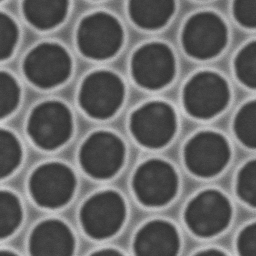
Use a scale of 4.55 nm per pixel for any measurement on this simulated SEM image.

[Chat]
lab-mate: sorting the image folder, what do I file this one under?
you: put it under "a regular array of holes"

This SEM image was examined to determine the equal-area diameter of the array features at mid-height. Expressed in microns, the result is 0.218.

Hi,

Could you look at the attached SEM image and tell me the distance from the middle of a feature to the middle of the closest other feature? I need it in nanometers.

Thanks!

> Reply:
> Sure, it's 267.